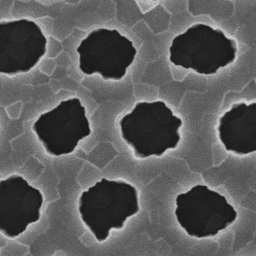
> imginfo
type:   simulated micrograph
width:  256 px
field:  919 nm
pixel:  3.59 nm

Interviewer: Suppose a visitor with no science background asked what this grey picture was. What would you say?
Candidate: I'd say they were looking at holes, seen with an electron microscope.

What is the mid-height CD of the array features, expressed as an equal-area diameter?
194 nm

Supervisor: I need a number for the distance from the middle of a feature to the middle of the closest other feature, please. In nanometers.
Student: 316